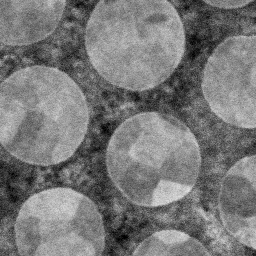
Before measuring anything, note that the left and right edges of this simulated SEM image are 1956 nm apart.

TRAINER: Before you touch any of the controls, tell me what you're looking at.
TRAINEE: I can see raised bodies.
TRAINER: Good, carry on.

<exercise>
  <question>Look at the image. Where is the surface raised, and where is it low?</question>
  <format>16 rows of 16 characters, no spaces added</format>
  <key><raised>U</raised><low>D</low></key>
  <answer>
UUUUDDUUUUUDDDDD
UUUUDUUUUUUDDDDD
UUDDDUUUUUUUDDUU
DDDDDDUUUUUDDUUU
DUUUDDUUUUUDDUUU
UUUUUDDDUDDDDUUU
UUUUUDDDDDDDDUUU
UUUUUDDDUUUDDDUU
UUUUUDDUUUUUDDDD
DUUUUDDUUUUUDDDD
DDDDDDDUUUUUDDUU
DDDDDDDUUUUUDDUU
DDUUUUDDUUUDDDUU
DUUUUUDDDDDDDDUU
DUUUUUDDDDUDDDDD
DUUUUUDDDUUUUDDD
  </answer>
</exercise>